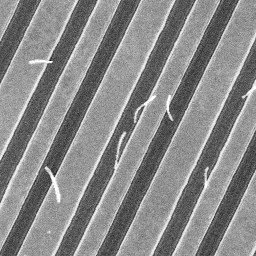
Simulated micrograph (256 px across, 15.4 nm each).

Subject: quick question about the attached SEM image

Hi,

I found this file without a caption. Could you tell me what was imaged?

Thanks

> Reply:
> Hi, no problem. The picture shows lines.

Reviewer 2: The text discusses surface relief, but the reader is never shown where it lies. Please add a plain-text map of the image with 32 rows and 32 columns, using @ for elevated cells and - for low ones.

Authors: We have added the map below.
@@---@@@@@--@@@--@@@@@--@@@---@@
@@--@@@@@---@@---@@@@---@@@--@@@
@---@@@@@--@@@---@@@@--@@@---@@@
@--@@@@@---@@---@@@@---@@@--@@@@
---@@@@@--@@@---@@@@--@@@---@@@@
---@@@@---@@---@@@@---@@@--@@@@@
--@@@@@--@@@---@@@@--@@@---@@@@-
--@@@@---@@---@@@@---@@@--@@@@@-
-@@@@@--@@@---@@@@--@@@---@@@@--
-@@@@---@@@--@@@@---@@@--@@@@@--
@@@@@--@@@---@@@@---@@---@@@@---
@@@@---@@@--@@@@@--@@@--@@@@@--@
@@@@--@@@---@@@@--@@@---@@@@---@
@@@---@@@--@@@@@--@@@--@@@@@--@@
@@@--@@@---@@@@---@@---@@@@---@@
@@---@@@--@@@@@--@@@--@@@@@--@@@
@@--@@@---@@@@---@@---@@@@---@@@
@---@@@--@@@@@--@@@--@@@@@--@@@-
@--@@@---@@@@---@@---@@@@---@@@-
---@@@--@@@@@--@@@---@@@@--@@@--
--@@@---@@@@---@@@--@@@@---@@@--
--@@@--@@@@@--@@@---@@@@---@@---
-@@@---@@@@---@@@--@@@@@--@@@--@
-@@@--@@@@@--@@@---@@@@---@@---@
-@@---@@@@---@@@--@@@@---@@@--@@
@@@--@@@@@--@@@---@@@@---@@---@@
@@---@@@@---@@@--@@@@@--@@@--@@@
@@--@@@@@--@@@---@@@@---@@---@@@
@---@@@@---@@@--@@@@@--@@@--@@@@
@--@@@@@--@@@---@@@@---@@---@@@@
---@@@@---@@@--@@@@@--@@@---@@@@
--@@@@@--@@@---@@@@---@@@--@@@@@